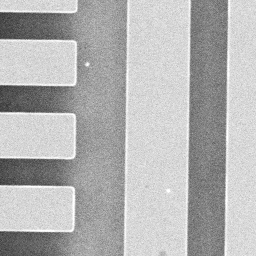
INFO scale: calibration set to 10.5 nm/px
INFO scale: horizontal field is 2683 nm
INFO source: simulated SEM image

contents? groups of lines, slits or small figures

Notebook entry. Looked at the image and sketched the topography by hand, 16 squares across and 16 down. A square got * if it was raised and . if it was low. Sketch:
*****...****..**
........****..**
*.......****..**
*****...****..**
*****...****..**
........****..**
........****..**
*****...****..**
*****...****..**
*****...****..**
........****..**
........****..**
*****...****..**
*****...****..**
........****..**
........****..**